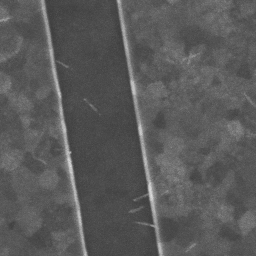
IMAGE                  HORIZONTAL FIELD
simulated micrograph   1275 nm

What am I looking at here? one or a few lines or trenches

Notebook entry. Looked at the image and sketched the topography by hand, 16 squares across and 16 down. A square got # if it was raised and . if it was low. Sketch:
###....#########
###.....########
###.....########
###.....########
###.....########
####....########
####....########
####.....#######
####.....#######
####.....#######
####.....#######
#####....#######
#####....#######
#####.....######
#####.....######
#####.....######